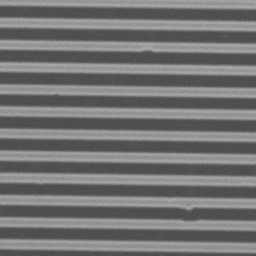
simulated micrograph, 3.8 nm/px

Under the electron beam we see parallel lines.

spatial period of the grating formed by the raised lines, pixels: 22.2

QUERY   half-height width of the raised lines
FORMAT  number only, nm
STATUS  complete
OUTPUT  32.6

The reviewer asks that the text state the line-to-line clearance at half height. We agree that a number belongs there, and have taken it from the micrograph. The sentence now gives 51.4 nanometres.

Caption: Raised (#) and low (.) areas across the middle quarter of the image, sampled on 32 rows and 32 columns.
##############################..
################################
................................
................................
................................
###.............................
################################
..##############################
................................
................................
................................
############################....
################################
...........................#####
................................
................................
................................
################################
################################
................................
................................
................................
#########################.......
################################
........................########
................................
................................
................................
################################
################################
................................
................................